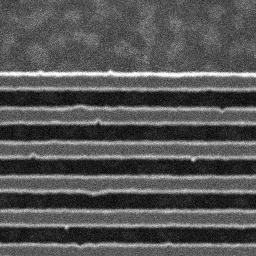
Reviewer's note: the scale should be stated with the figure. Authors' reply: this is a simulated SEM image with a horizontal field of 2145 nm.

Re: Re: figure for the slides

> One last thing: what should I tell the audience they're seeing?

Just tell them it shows parallel lines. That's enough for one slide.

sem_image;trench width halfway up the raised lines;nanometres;151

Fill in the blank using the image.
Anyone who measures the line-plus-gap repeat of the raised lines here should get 286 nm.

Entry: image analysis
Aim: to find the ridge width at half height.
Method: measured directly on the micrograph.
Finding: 136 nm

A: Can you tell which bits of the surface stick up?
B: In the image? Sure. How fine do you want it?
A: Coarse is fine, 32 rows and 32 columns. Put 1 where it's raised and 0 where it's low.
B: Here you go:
00000000000000000000000000000000
00000000000000000000000000000000
00000000000000000000000000000000
00000000000000000000000000000000
00000000000000000000000000000000
00000000000000000000000000000000
00000000000000000000000000000000
00000000000000000000000000000000
00000000000000000000000000000000
11111111111111111111111111111111
11111111111111111111111111111111
00000000000000000000000000000000
00000000000000000000000000000000
11111101111111111111100000000000
11111111111111111111111111111111
00000000000001111101101011110111
00000000000000000000000000000000
00000000000000000000000000000000
11111111111111111111111111111111
11111111111111111111111111111111
00000000000000000000000000000000
00000000000000000000000000000000
11111111111111111111111111111111
11111111111111111111111111111111
00000000000000000000000000000000
00000000000000000000000000000000
11111111111111111111111111111111
11111111111111111111111111111111
00000000000000000000000000000000
00000000000000000000000000000000
01111011000100000000000000000000
11111111111111111111111111111111